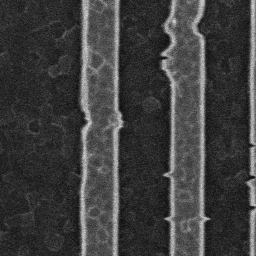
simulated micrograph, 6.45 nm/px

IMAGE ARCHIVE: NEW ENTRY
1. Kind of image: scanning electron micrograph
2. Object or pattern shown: one or a few lines or trenches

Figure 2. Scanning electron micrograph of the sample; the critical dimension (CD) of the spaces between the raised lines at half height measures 330 nm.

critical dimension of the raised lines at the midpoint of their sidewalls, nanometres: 202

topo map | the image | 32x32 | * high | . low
...........****.......***.......
...........****.......***.......
...........****......****.......
...........****......***........
...........****......****.......
...........****.......***.......
...........****......****.......
...........****......****.......
..........*****......****.......
..........*****......****.......
..........****........***.......
..........*****.......***.......
...........****.......***.......
...........****.......***.......
...........****.......***.......
...........****.......***.......
...........****.......***.......
...........***........***.......
...........***........***.......
...........***........***.......
...........***........***.......
...........***.......****.......
..........****.......****.......
..........****........***.......
..........****........***.......
..........****........***.......
..........****........***.......
..........****.......*****......
..........****........***.......
..........****........***.......
...........***........***.......
..........****........***.......